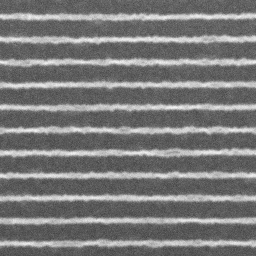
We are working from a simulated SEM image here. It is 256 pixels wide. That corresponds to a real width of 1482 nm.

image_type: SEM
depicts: parallel lines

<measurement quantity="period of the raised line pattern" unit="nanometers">131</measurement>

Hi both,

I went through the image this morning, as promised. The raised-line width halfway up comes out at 24.6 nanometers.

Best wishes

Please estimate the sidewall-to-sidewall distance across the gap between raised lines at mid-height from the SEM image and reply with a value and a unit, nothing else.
105 nanometres